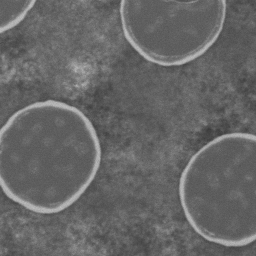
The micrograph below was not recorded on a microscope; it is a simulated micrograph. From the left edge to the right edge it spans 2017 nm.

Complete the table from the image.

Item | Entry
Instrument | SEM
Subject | raised bodies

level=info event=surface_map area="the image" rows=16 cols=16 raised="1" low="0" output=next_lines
1100000011111100
1000000011111100
0000000011111000
0000000001110000
0000000000000000
0000000000000000
0000000000000000
0111100000000000
1111110000000010
1111110000001111
1111110000001111
1111100000011111
0111000000011111
0000000000001111
0000000000001111
0000000000000000